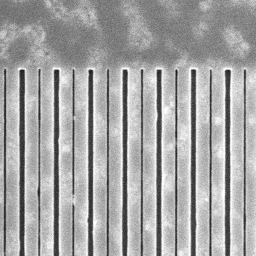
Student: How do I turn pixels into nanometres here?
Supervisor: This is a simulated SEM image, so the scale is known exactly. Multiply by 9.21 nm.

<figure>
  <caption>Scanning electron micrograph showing parallel lines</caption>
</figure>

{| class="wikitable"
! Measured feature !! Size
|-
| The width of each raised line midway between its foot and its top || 0.119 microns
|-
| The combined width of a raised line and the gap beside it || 0.159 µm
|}